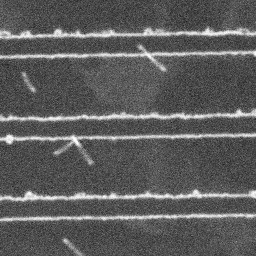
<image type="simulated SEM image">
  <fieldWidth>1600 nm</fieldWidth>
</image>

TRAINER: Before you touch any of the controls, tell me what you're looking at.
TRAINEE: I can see lines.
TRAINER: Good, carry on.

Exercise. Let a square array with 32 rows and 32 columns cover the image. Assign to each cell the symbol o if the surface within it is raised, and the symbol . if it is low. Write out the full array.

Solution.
................................
................................
................................
................................
o..ooooooooooooooooooooooooooooo
oooooooooooooooooooooooooooooooo
oooooooooooooooooooooooooooooooo
................................
................................
................................
................................
................................
................................
................................
..........o...oooooo.ooooooooooo
oooooooooooooooooooooooooooooooo
oooooooooooooooooooooooooooooooo
oo..............................
................................
................................
................................
................................
................................
................................
...o.............oo.o.oooooooooo
oooooooooooooooooooooooooooooooo
oooooooooooooooooooooooooooooooo
................................
................................
................................
................................
................................